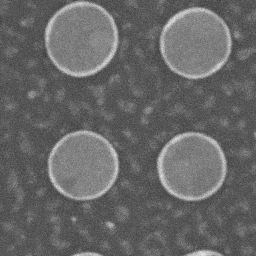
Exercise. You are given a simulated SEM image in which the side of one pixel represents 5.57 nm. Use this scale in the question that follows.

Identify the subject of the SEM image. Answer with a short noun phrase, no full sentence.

raised bodies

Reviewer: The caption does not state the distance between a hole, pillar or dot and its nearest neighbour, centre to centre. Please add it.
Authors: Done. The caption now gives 111 px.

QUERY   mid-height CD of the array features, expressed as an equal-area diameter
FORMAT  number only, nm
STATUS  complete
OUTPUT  380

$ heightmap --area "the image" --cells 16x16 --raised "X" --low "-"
----XX----------
---XXXX----XXX--
---XXXX---XXXX--
---XXXX---XXXX--
----XX-----XX---
----------------
----------------
----------------
----XX-----XX---
---XXXX---XXXX--
---XXXX---XXXX--
---XXXX---XXXX--
----------------
----------------
----------------
----------------